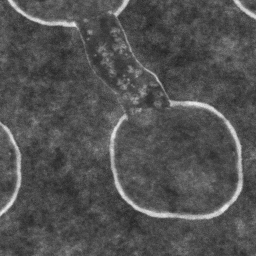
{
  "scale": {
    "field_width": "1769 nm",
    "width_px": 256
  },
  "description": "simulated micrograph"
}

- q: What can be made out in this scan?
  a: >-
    raised bodies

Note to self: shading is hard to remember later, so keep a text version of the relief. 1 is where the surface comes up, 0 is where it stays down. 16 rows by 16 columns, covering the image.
0111111100000001
0000111000000000
0000011100000000
0000011100000000
0000001110000000
0000000111000000
0000000011110000
0000000011111100
1000000111111110
1000000111111110
1000000111111110
1000000111111110
1000000011111110
0000000000011000
0000000000000000
0000000000000000